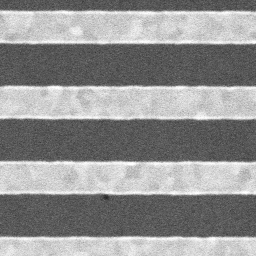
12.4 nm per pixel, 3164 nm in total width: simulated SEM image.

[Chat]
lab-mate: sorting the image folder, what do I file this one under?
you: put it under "wiring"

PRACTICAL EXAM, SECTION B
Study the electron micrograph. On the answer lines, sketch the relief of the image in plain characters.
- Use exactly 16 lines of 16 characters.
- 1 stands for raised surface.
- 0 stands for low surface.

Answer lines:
0000000000000000
1111111111111111
1111111111111111
0000000000000000
0000000000000000
1111111111111111
1111111111111111
0000000000000000
0000000000000000
0000000000000000
1111111111111111
1111111111111111
0000000000000000
0000000000000000
0000000000000000
1111111111111111